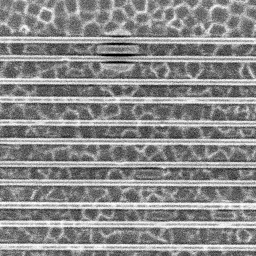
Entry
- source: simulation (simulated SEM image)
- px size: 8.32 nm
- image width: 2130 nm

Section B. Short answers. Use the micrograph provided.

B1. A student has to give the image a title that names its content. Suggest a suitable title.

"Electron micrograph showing parallel lines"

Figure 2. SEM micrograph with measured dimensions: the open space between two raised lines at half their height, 0.132 µm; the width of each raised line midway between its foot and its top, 0.0385 microns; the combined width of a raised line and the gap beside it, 0.172 um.